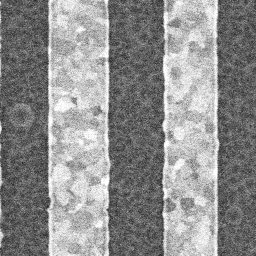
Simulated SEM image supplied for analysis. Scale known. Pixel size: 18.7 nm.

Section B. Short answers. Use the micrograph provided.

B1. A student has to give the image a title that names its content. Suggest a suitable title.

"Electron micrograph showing one or a few lines or trenches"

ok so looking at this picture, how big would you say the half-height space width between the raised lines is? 1080 nm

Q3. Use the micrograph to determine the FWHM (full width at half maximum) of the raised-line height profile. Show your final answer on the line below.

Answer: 1030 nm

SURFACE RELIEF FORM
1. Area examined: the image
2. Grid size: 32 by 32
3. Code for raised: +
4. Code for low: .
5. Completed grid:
......+++++++........++++++.....
......+++++++........++++++.....
......+++++++........++++++.....
......+++++++........++++++.....
......+++++++........++++++.....
......+++++++........++++++.....
......+++++++........++++++.....
......+++++++........++++++.....
......+++++++........++++++.....
......+++++++........++++++.....
......+++++++........++++++.....
......+++++++........++++++.....
......+++++++........++++++.....
......+++++++........++++++.....
......+++++++........++++++.....
......+++++++........++++++.....
......+++++++........++++++.....
......+++++++........++++++.....
......+++++++........++++++.....
......+++++++........++++++.....
......++++++++.......++++++.....
......++++++++.......++++++.....
......+++++++.......+++++++.....
......+++++++........++++++.....
......++++++++.......++++++.....
......+++++++........++++++.....
......+++++++........++++++.....
......+++++++........++++++.....
......+++++++........++++++.....
......++++++++.......++++++.....
......+++++++........++++++.....
......+++++++........++++++.....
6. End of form